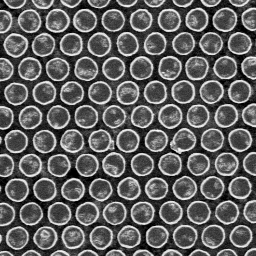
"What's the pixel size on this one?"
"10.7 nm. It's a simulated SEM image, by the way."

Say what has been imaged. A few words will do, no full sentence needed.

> a regular array of raised bodies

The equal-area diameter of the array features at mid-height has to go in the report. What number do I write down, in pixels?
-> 22.2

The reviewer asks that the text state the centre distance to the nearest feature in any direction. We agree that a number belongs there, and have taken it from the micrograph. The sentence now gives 294 nm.